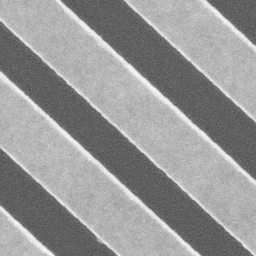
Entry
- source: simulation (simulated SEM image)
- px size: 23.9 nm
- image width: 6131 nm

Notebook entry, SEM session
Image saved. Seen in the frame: lines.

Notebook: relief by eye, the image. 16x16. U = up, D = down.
UUUUDDDDUUUUUDDD
UUUUUDDDDUUUUUDD
DUUUUUDDDDUUUUUD
DDUUUUUDDDDDUUUU
DDDUUUUUUDDDDUUU
UDDDDUUUUUDDDDUU
UUDDDDUUUUUDDDDU
UUUDDDDUUUUUDDDD
UUUUDDDDUUUUUDDD
UUUUUDDDDUUUUUDD
DUUUUUUDDDUUUUUD
DDDUUUUUDDDUUUUU
DDDDUUUUUDDDUUUU
UDDDDUUUUUDDDUUU
UUDDDDUUUUUDDDUU
UUUDDDDUUUUUDDDU